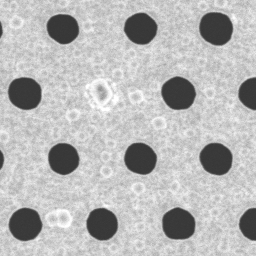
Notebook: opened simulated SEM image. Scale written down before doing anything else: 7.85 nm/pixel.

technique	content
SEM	a regular array of holes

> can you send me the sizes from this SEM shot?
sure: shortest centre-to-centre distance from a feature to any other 0.591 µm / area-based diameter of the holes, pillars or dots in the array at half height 258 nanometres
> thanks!